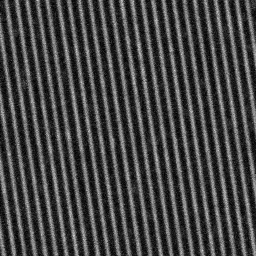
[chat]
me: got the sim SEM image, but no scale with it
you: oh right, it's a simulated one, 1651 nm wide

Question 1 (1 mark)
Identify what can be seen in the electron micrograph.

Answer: parallel lines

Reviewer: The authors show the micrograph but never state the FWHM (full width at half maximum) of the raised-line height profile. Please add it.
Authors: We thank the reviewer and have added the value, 18.3 nanometres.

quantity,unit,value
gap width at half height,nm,49.3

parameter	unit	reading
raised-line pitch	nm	66.7